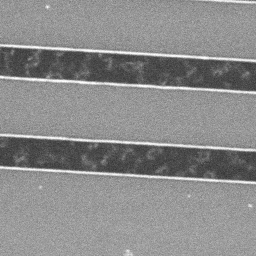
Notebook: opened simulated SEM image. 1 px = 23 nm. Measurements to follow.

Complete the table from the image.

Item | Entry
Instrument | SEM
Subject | one or a few lines or trenches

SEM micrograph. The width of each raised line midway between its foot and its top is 0.749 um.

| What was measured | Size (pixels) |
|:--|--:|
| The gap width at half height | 56.8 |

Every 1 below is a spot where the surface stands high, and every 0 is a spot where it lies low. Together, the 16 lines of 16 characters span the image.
0000000000000000
0000000000000000
0000000000000000
1111111111110000
1111111111111111
0000000000011111
0000000000000000
0000000000000000
1100000000000000
1111111111111111
1111111111111111
0000000000000000
0000000000000000
0000000000000000
0000000000000000
0000000000000000